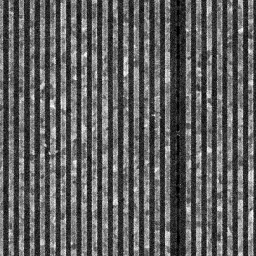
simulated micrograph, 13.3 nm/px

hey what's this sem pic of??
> parallel lines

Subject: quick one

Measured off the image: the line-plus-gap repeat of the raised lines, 0.139 um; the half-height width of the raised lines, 0.0583 µm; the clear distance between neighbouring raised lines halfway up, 80 nm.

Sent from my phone